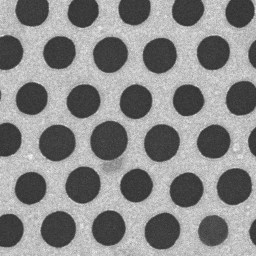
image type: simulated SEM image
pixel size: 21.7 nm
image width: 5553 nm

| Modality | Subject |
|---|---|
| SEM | a regular array of holes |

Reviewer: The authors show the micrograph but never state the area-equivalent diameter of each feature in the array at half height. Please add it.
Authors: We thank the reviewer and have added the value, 753 nm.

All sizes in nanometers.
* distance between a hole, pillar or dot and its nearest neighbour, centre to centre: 1060